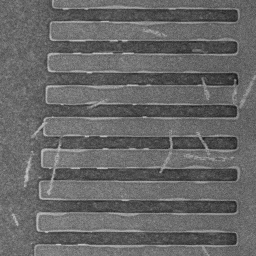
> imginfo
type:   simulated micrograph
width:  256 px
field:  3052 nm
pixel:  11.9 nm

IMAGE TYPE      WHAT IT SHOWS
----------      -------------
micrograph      groups of lines, slits or small figures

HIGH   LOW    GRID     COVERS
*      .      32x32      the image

.......*************************
..............................**
..............................**
......**************************
......**************************
..............................**
.............................***
......**************************
......**************************
..............................**
.........................*...***
......**************************
......**************************
..............................**
.............................***
.....***************************
......**************************
..............................**
.....................*...*...***
.....***************************
.....***************************
..............................**
......*......................***
.....***************************
.....***************************
..............................**
.............................***
.....***************************
.....***************************
..............................**
.............................***
....****************************